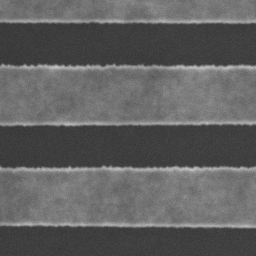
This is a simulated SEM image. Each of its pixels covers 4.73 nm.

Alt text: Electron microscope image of lines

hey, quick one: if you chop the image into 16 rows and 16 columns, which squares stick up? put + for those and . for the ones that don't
++++++++++++++++
................
................
................
++++++++++++++++
++++++++++++++++
++++++++++++++++
++++++++++++++++
................
................
.+...+++..++++++
++++++++++++++++
++++++++++++++++
++++++++++++++++
................
................